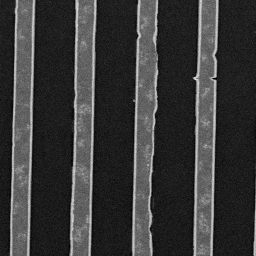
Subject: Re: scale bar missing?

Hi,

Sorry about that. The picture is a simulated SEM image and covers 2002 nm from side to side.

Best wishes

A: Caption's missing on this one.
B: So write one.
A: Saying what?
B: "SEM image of one or a few lines or trenches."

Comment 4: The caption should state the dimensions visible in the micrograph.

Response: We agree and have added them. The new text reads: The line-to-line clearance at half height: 341 nanometres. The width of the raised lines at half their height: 0.135 µm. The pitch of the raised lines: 478 nanometres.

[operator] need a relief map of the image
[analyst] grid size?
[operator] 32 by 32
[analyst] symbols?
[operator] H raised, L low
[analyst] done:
LLHHLLLLLLHHLLLLLHHHLLLLLHHLLLLL
LLHHLLLLLLHHLLLLLHHHLLLLLHHLLLLL
LLHHLLLLLLHHLLLLLHHLLLLLLHHLLLLL
LLHHLLLLLLHHLLLLLHHHLLLLLHHLLLLL
LLHHLLLLLLHHLLLLLHHLLLLLLHHLLLLL
LLHHLLLLLLHHLLLLLHHLLLLLLHHLLLLL
LLHHLLLLLLHHLLLLLHHHLLLLLHHLLLLL
LLHHLLLLLHHHLLLLLHHHLLLLLHHLLLLL
LLHHLLLLLHHHLLLLLHHHLLLLLHHLLLLL
LLHHLLLLLHHHLLLLLHHHLLLLLHHLLLLL
LLHHLLLLLLHHLLLLLHHLLLLLLHHLLLLL
LLHHLLLLLLHHLLLLLHHLLLLLLHHLLLLL
LLHHLLLLLHHHLLLLLHHHLLLLLHHLLLLL
LLHHLLLLLHHHLLLLLHHHLLLLLHHLLLLL
LLHHLLLLLLHHLLLLLHHLLLLLLHHLLLLL
LLHHLLLLLLHHLLLLLHHLLLLLLHHLLLLL
LLHHLLLLLHHLLLLLLHHLLLLLLHHLLLLL
LLHHLLLLLHHLLLLLLHHLLLLLLHHLLLLL
LLHHLLLLLHHLLLLLLHHLLLLLLHHLLLLL
LLHHLLLLLHHLLLLLLHHLLLLLLHHLLLLL
LLHHLLLLLHHLLLLLLHHLLLLLLHHLLLLL
LLHHLLLLLHHLLLLLLHHLLLLLLHHLLLLL
LLHHLLLLLHHLLLLLLHHLLLLLHHHLLLLL
LLHHLLLLLHHLLLLLLHHLLLLLHHHLLLLL
LLHHLLLLLHHLLLLLLHHLLLLLLHHLLLLL
LLHHLLLLLHHLLLLLLHHLLLLLHHHLLLLL
LHHHLLLLLHHLLLLLLHHLLLLLHHHLLLLL
LHHHLLLLLHHLLLLLLHHLLLLLHHHLLLLL
LHHHLLLLLHHLLLLLLHHLLLLLHHHLLLLL
LHHHLLLLLHHLLLLLLHHLLLLLHHHLLLLL
LHHHLLLLLHHLLLLLLHHLLLLLHHLLLLLL
LHHLLLLLLHHLLLLLLHHLLLLLHHLLLLLL